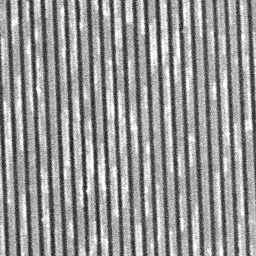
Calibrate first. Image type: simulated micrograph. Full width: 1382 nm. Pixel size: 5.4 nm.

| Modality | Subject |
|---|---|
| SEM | parallel lines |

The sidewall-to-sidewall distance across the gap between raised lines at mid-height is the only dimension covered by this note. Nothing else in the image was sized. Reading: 31 nm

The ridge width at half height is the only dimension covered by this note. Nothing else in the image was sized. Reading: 5.74 pixels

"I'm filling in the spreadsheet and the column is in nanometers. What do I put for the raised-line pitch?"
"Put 61.9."